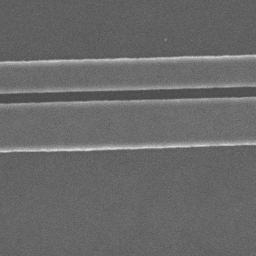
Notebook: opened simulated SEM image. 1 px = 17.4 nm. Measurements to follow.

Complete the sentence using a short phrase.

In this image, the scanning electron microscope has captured lines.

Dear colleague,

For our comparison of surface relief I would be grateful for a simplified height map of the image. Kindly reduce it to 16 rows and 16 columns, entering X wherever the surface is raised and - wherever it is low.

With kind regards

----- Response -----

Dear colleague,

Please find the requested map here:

----------------
----------------
----------------
----------------
XXXXXXXXXXXXXXXX
XXXXXXXXXXXXXXXX
XXXXXXXXXXXXXXXX
XXXXXXXXXXXXXXXX
XXXXXXXXXXXXXXXX
----------------
----------------
----------------
----------------
----------------
----------------
----------------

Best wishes